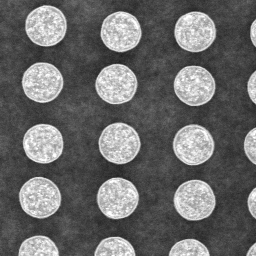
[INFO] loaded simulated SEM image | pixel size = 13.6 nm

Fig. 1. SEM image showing a regular array of raised bodies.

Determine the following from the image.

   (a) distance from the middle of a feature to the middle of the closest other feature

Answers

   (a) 0.744 um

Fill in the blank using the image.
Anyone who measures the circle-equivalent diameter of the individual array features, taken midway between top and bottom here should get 548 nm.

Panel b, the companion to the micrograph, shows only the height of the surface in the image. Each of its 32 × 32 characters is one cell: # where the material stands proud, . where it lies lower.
................................
....####................#.......
...#####.....####.....####......
...#####.....#####....#####....#
....####.....#####....#####....#
.....##......####.....####......
................................
................................
....###......###.......##.......
...#####....#####.....####.....#
...#####....#####.....#####....#
...####.....#####.....#####....#
....##.......###.......###......
................................
................................
..............##................
...####......####.....####.....#
...#####....#####.....#####....#
...#####....#####.....#####....#
....###......####.....####.....#
.......................##.......
................................
....##........##................
...####......####.....####......
..#####.....#####.....#####....#
...####.....#####.....#####....#
...####......####.....####.....#
........................#.......
................................
................................
...####.....####......###.......
..#####.....#####....#####.....#